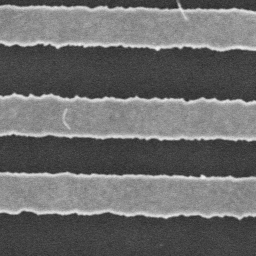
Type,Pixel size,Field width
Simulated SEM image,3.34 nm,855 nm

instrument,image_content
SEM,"lines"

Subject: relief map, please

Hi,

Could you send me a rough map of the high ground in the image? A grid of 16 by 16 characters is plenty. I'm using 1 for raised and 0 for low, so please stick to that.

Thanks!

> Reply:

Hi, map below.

1111111110000000
1111111111111111
1111111111111111
0000000000000000
0000000000000000
0000000000000000
1111111111111111
1111111111111111
0010111111111111
0000000000000000
0000000000000000
1111111111111111
1111111111111111
0000000001100111
0000000000000000
0000000000000000